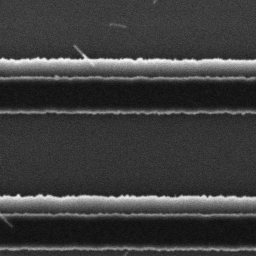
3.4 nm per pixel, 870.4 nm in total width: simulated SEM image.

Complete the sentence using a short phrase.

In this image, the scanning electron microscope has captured lines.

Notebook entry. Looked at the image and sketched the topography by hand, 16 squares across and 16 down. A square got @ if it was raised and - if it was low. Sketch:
----------------
----------------
----------------
----------------
@@@@@@@@@@@@@@@@
@@@@@@@@@@@@@@@@
@@@@@@@@@@@@@@@@
----------------
----------------
----------------
----------------
----------------
@@@@@@@@@@@@@@@@
@@@@@@@@@@@@@@@@
@@@@@@@@@@@@@@@@
@@@@@@@@@@@@@@@@